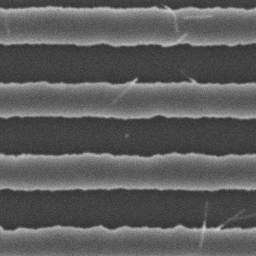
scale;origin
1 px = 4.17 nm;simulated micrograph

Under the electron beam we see lines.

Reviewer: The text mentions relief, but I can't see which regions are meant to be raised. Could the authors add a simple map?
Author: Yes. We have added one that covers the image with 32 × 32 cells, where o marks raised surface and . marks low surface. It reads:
................................
oooooooooooooooooooooooooooooooo
oooooooooooooooooooooooooooooooo
oooooooooooooooooooooooooooooooo
oooooooooooooooooooooooooooooooo
o........ooo.ooooooooo..ooooooo.
................................
................................
................................
................................
oooooooo..oooo.oooooooooo.o..ooo
oooooooooooooooooooooooooooooooo
oooooooooooooooooooooooooooooooo
oooooooooooooooooooooooooooooooo
ooooooooooooooooooo.oooooooooooo
................................
................................
................................
................................
oooooooooooooo.o...oooooooo.oooo
oooooooooooooooooooooooooooooooo
oooooooooooooooooooooooooooooooo
oooooooooooooooooooooooooooooooo
oooooooooooooooooooooooooooooooo
................................
................................
................................
................................
......oooo.oo..oooo..oo..o.....o
oooooooooooooooooooooooooooooooo
oooooooooooooooooooooooooooooooo
oooooooooooooooooooooooooooooooo